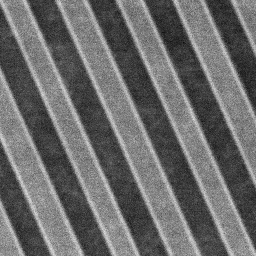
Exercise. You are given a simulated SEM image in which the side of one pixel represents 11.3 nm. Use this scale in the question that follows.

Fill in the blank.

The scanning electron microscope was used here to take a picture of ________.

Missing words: parallel lines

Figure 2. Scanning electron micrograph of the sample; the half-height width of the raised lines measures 0.264 micrometres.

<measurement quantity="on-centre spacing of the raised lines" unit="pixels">53.6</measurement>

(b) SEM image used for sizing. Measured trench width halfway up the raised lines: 329 nanometers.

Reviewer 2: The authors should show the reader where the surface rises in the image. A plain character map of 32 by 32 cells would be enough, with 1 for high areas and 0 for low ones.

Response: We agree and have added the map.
11100001111000011100001111000111
01110000111000011100001111000011
01110000111100001110000111000011
00111000011100001110000111100001
00111000011110000111000011100001
00011100001110000111000011110001
00011100001111000011100001110000
00011100001111000011100001111000
00001110000111000011110000111000
00001110000111100001110000111100
10000111000011100001110000111100
10000111000011110000111000011100
11000011100001110000111000011110
11000011100001111000011100001110
11000011100000111000011100001111
11100001110000111100001110000111
11100001110000111100001110000111
11110000111000011110001111000011
01110000111000011110000111000011
01111000011100001110000111000011
00111000011100001111000011100001
00111100001110000111000011100001
00111100001110000111100001110000
00011110001110000011100001110000
00011110000111000011110000111000
00001110000111000011110000111000
00001111000011100001111000111100
10000111000011100001111000011100
10000111100001110000111000011100
11000011100001110000111100001110
11000011110000111000011100001110
11100011110000111000011110000111